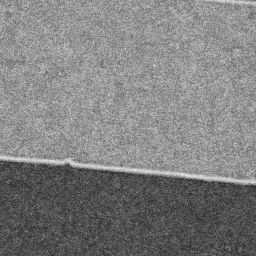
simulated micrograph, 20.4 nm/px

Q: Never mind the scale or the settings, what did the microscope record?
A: one or a few lines or trenches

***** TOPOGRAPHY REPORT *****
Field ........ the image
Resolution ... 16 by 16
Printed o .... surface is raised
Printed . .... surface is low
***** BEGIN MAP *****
oooooooooooooooo
oooooooooooooooo
oooooooooooooooo
oooooooooooooooo
oooooooooooooooo
oooooooooooooooo
oooooooooooooooo
oooooooooooooooo
oooooooooooooooo
oooooooooooooooo
.......ooooooooo
................
................
................
................
................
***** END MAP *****